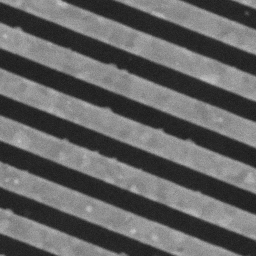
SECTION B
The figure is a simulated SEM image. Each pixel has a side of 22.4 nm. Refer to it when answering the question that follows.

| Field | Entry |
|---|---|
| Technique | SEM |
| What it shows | lines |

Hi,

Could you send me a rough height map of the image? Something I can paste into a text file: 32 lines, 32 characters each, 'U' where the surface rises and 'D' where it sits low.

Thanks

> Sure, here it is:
DUUUUUUUDDDDDDDDUUUUUUUUDDDDDDUU
DDDDUUUUUUUDDDDDDDUUUUUUUUDDDDDD
DDDDDDUUUUUUUUDDDDDDDUUUUUUUUDDD
UDDDDDDDUUUUUUUUDDDDDDDUUUUUUUUD
UUUUDDDDDDDUUUUUUUUDDDDDDDUUUUUU
UUUUUUUDDDDDDDUUUUUUUUDDDDDDDUUU
DUUUUUUUUDDDDDDDUUUUUUUUDDDDDDDU
DDDDUUUUUUUUDDDDDDDUUUUUUUUDDDDD
DDDDDDDUUUUUUUDDDDDDDUUUUUUUUDDD
UUDDDDDDDUUUUUUUUDDDDDDDUUUUUUUU
UUUUUDDDDDDDUUUUUUUDDDDDDDDUUUUU
UUUUUUUDDDDDDDUUUUUUUUDDDDDDDUUU
DDUUUUUUUUDDDDDDDUUUUUUUUDDDDDDD
DDDDDUUUUUUUUDDDDDDDUUUUUUUDDDDD
DDDDDDDUUUUUUUUDDDDDDDUUUUUUUUDD
UUUDDDDDDDUUUUUUUDDDDDDDUUUUUUUU
UUUUUDDDDDDDUUUUUUUUDDDDDDDUUUUU
UUUUUUUUDDDDDDDUUUUUUUUDDDDDDDUU
DDDUUUUUUUDDDDDDDUUUUUUUUDDDDDDD
DDDDDUUUUUUUUDDDDDDDUUUUUUUUDDDD
UDDDDDDDUUUUUUUDDDDDDDDUUUUUUUUD
UUUDDDDDDDUUUUUUUUDDDDDDDUUUUUUU
UUUUUUDDDDDDDUUUUUUUUDDDDDDDUUUU
UUUUUUUUDDDDDDDUUUUUUUUDDDDDDDUU
DDDUUUUUUUUDDDDDDDUUUUUUUUDDDDDD
DDDDDDUUUUUUUUDDDDDDDUUUUUUUDDDD
UDDDDDDDUUUUUUUUDDDDDDDUUUUUUUUD
UUUUDDDDDDDUUUUUUUDDDDDDDUUUUUUU
UUUUUUDDDDDDDUUUUUUUUDDDDDDDUUUU
DUUUUUUUUDDDDDDDUUUUUUUUDDDDDDDU
DDDDUUUUUUUDDDDDDDUUUUUUUUDDDDDD
DDDDDDUUUUUUUUDDDDDDDUUUUUUUUDDD